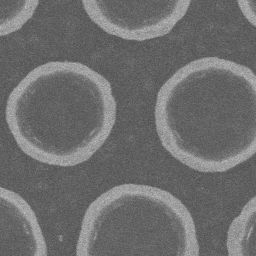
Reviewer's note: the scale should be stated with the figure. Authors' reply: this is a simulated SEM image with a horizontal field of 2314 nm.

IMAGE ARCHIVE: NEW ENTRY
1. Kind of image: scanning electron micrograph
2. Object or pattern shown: raised bodies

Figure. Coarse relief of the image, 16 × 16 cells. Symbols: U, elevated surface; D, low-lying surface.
UUDDDDUUUUUDDDDU
UDDDDDDUUUDDDDDD
DDDDDDDDDDDDDDDD
DDDDDDDDDDDDDDDD
DDUUUDDDDDDDUUUD
DUUUUUDDDDUUUUUU
DUUUUUUDDDUUUUUU
DUUUUUUDDDUUUUUU
DUUUUUDDDDUUUUUU
DDUUUDDDDDDUUUUD
DDDDDDDDDDDDDDDD
DDDDDDDDDDDDDDDD
UDDDDDDUUUUDDDDD
UUDDDDUUUUUDDDDU
UUDDDUUUUUUUDDDU
UUUDDUUUUUUUDDDU